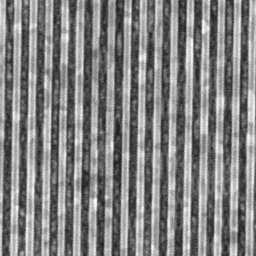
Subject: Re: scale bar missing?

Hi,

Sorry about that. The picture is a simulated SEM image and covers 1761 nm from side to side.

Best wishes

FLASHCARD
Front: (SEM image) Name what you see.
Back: parallel lines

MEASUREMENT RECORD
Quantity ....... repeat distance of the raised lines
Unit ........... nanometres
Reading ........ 108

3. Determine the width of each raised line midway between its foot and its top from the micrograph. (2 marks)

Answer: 39.5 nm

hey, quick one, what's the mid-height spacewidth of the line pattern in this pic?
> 9.49 px